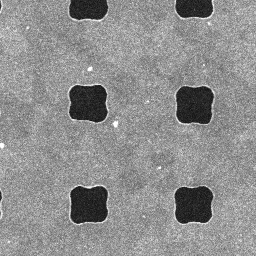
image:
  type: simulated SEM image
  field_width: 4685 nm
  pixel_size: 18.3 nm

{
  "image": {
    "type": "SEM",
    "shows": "holes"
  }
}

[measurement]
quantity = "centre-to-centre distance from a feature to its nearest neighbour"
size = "1840 nm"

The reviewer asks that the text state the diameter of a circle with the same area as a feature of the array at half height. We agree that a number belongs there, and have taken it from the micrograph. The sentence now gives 40.4 pixels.